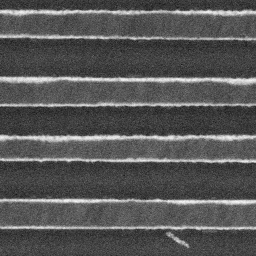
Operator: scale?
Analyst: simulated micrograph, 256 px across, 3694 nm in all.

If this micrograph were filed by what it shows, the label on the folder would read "lines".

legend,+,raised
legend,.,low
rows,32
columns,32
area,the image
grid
................................
+++++++++++++++++++++++++++...++
++++++++++++++++++++++++++++++++
++++++++++++++++++++++++++++++++
++++++++++++++++++++++++++++++++
................................
................................
................................
................................
................................
++++++++++++++++++++++++++++++++
++++++++++++++++++++++++++++++++
++++++++++++++++++++++++++++++++
................................
................................
................................
................................
++++++++++++++++++++++++++++++++
++++++++++++++++++++++++++++++++
++++++++++++++++++++++++++++++++
................................
................................
................................
................................
................................
++++++++++++++++++++++++++++++++
++++++++++++++++++++++++++++++++
++++++++++++++++++++++++++++++++
................+....++.++++++++
................................
................................
................................